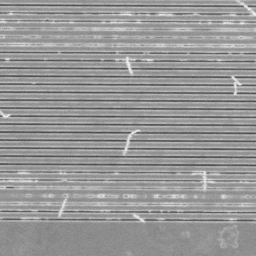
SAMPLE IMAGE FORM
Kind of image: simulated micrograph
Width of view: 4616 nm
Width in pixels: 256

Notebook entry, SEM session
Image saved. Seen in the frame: parallel lines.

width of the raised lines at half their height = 108 nanometers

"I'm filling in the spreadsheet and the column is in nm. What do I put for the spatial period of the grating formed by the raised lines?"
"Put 143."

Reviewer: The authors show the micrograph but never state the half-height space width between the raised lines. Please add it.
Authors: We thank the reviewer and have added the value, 36.1 nanometres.